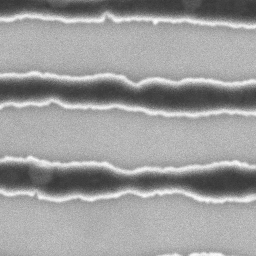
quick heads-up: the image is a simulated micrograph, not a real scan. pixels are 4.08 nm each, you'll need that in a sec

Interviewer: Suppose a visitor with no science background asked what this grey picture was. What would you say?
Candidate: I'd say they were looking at one or a few lines or trenches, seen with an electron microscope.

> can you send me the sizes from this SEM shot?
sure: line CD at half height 133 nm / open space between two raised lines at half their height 0.223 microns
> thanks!